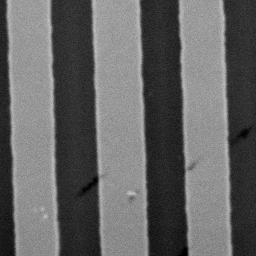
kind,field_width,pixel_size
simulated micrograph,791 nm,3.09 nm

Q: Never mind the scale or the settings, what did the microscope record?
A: lines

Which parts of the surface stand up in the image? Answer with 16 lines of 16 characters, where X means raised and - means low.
XXX---XXX--XXX--
XXX---XXX--XXX--
-XX---XXX--XXX--
-XX---XXX--XXX--
-XX---XXX--XXX--
-XX---XXX--XXX--
-XX---XXX---XX--
-XX---XXX---XX--
-XX---XXX---XX--
-XX---XXX---XX--
-XX---XXX---XX--
-XX---XXX---XX--
-XX---XXX---XX--
-XXX--XXX---XX--
-XXX--XXX---XX--
-XXX--XXX---XX--